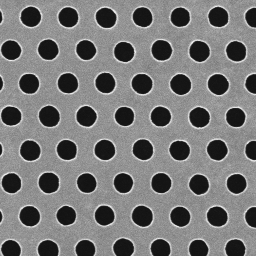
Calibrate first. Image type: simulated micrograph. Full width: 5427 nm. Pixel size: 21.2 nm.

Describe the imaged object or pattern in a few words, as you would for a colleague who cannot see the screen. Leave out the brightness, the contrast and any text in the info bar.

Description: a regular array of holes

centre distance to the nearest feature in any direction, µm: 0.783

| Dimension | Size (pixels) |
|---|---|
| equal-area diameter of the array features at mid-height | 20.2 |